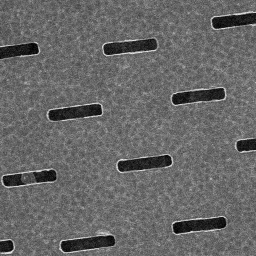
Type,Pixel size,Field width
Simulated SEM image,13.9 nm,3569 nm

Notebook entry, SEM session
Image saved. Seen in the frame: holes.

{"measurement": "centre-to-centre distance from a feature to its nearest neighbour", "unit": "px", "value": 82.3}